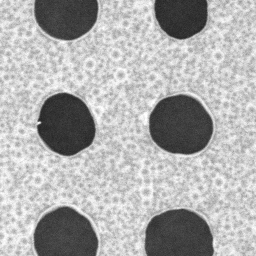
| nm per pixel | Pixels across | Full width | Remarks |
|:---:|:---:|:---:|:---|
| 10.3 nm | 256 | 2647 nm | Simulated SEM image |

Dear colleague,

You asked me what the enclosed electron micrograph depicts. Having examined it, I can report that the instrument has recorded holes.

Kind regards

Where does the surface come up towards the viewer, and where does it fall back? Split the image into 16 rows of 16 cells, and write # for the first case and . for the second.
##....####...###
##....####...###
####.###########
################
################
################
###..#####...###
##....###....###
##....###....###
###..#####..####
################
################
################
###..#####...###
##....###....###
##....###....###